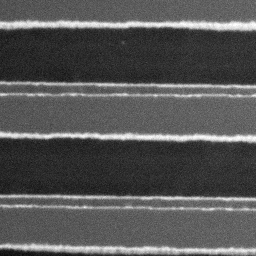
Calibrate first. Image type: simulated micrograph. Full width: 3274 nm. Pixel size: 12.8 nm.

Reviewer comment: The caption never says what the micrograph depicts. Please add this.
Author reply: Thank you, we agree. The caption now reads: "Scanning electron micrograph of lines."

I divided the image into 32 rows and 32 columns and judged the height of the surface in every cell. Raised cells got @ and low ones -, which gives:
@@@@@@@@@@@@@@@@@@@@@@@@@@@@@@@@
@@@@@@@@@@@@@@@@@@@@@@@@@@@@@@@@
@@@@@@@@@@@@@@@@@@@@@@@@@@@@@@@@
--------------------------------
--------------------------------
--------------------------------
--------------------------------
--------------------------------
--------------------------------
--------------------------------
@@@@@@--------------------------
@@@@@@@@@@@@@@@@@@@@@@@@@@@@@@@@
@@@@@@@@@@@@@@@@@@@@@@@@@@@@@@@@
@@@@@@@@@@@@@@@@@@@@@@@@@@@@@@@@
@@@@@@@@@@@@@@@@@@@@@@@@@@@@@@@@
@@@@@@@@@@@@@@@@@@@@@@@@@@@@@@@@
@@@@@@@@@@@@@@@@@@@@@@@@@@@@@@@@
--------------------------------
--------------------------------
--------------------------------
--------------------------------
--------------------------------
--------------------------------
--------------------------------
--------------------------------
@@@@@@@@@@@@@@@@@@@@@@@@@@@@@@@@
@@@@@@@@@@@@@@@@@@@@@@@@@@@@@@@@
@@@@@@@@@@@@@@@@@@@@@@@@@@@@@@@@
@@@@@@@@@@@@@@@@@@@@@@@@@@@@@@@@
@@@@@@@@@@@@@@@@@@@@@@@@@@@@@@@@
@@@@@@@@@@@@@@@@@@@@@@@@@@@@@@@@
--------------------------------